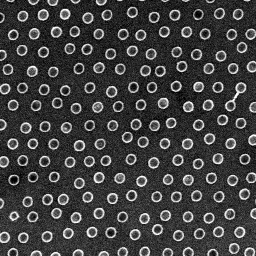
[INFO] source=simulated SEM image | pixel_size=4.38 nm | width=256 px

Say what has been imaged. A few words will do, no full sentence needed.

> a regular array of raised bodies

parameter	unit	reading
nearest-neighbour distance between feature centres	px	18.4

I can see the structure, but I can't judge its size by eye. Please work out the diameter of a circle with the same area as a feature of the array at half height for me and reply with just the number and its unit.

45.3 nanometres